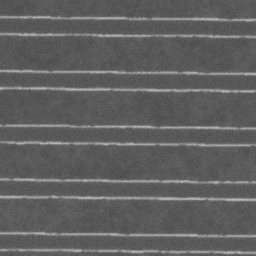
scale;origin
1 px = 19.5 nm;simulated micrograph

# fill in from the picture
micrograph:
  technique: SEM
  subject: lines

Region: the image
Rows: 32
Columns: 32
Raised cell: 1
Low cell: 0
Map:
00000000000000000000000000000000
00000000000000000000000000000000
11111111111111111111111111110000
11111111111111111111111111111111
00000000000000000000000001111111
00000000000000000000000000000000
00000000000000000000000000000000
00000000000000000000000000000000
00000000000000000000000000000000
11111111111111111111111111111111
11111111111111111111111111111111
00000000000000000000000000000000
00000000000000000000000000000000
00000000000000000000000000000000
00000000000000000000000000000000
00000000000000000000000000000000
11111111111111111111111111111111
11111111111111111111111111111111
00000000000000000000000000000000
00000000000000000000000000000000
00000000000000000000000000000000
00000000000000000000000000000000
10000000000000000000000000000000
11111111111111111111111111111111
11111111111111111111111111111111
00000000000000000000000000000000
00000000000000000000000000000000
00000000000000000000000000000000
00000000000000000000000000000000
11111111111111111111111111110000
11111111111111111111111111111111
00000000000000000000011000011111